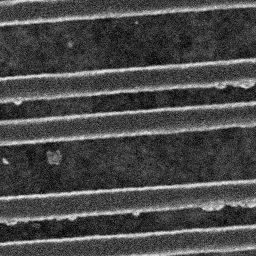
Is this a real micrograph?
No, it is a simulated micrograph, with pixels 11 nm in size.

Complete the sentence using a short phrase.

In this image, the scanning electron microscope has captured lines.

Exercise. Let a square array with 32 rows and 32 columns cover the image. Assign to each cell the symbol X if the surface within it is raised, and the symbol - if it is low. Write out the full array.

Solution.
XXXXXXXXXXXXXXXXXXXXXXXXXXXXXXXX
XXXXXXXXXXXXXXXXXXXXX-----------
XXXXXXX-------------------------
--------------------------------
--------------------------------
--------------------------------
--------------------------------
-------------------------------X
-------------------XXXXXXXXXXXXX
----XXXXXXXXXXXXXXXXXXXXXXXXXXXX
XXXXXXXXXXXXXXXXXXXXXXXXXXXX--XX
XXXXXXXXXXXXXXX-----------------
XXX-----------------------------
-----------------------XXXXXXXXX
----------XXXXXXXXXXXXXXXXXXXXXX
XXXXXXXXXXXXXXXXXXXXXXXXXXXXXX--
XXXXXXXXXXXXXXXXXXXX------------
XXXXXXXX------------------------
--------------------------------
--------------------------------
--------------------------------
--------------------------------
--------------------------------
------------------XXXXXXXXXXXXXX
-----XXXXXXXXXXXXXXXXXXXXXXXXXXX
XXXXXXXXXXXXXXXXXXXXXXXXXXXX---X
XXXXXXXXXXXXXXXX----------------
XX------------------------------
-----------------------------XXX
--------------XXXXXXXXXXXXXXXXXX
XXXXXXXXXXXXXXXXXXXXXXXXXXXXXXXX
XXXXXXXXXXXXXXXXXXXXXXX---------